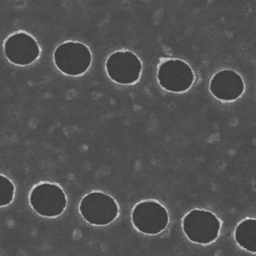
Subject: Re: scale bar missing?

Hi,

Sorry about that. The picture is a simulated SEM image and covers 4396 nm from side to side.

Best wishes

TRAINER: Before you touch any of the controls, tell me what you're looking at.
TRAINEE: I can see a regular array of holes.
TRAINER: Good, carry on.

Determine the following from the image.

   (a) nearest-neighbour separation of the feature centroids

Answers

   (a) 892 nm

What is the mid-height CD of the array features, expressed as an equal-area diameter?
587 nanometers